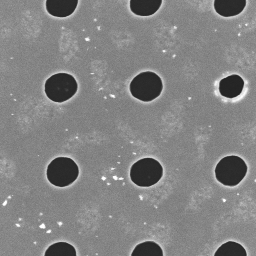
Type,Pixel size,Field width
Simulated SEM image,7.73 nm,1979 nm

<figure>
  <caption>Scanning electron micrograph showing holes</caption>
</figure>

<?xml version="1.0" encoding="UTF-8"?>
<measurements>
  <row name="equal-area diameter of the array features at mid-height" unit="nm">236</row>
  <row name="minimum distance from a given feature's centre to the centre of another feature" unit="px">84.1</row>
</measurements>